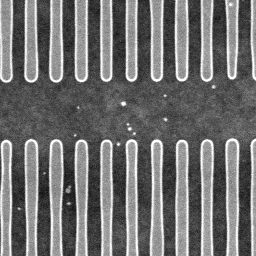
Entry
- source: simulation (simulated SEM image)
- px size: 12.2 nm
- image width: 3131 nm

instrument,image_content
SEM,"groups of lines, slits or small figures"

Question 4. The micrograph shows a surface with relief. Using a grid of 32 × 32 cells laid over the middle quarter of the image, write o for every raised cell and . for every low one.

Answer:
...ooo...ooo....oo....ooo...ooo.
...ooo...ooo....oo....ooo...ooo.
...ooo...ooo....oo....ooo...ooo.
...ooo....oo....oo....oo....oo..
................................
................................
................................
................................
................................
................................
................................
................................
................................
................................
................................
................................
................................
................................
................................
...oo.....oo....oo....oo.....o..
...ooo....oo....oo....oo....ooo.
...ooo...ooo....oo....oo....ooo.
...ooo...ooo....oo....oo....ooo.
...ooo...ooo....oo....oo....ooo.
...ooo...ooo....oo....oo....ooo.
...ooo...ooo....oo....oo....ooo.
...ooo...ooo....oo....oo....ooo.
...ooo...ooo....oo....oo....ooo.
...ooo...ooo....oo....oo....ooo.
...ooo...ooo....oo....oo....ooo.
...ooo...ooo....oo....oo....ooo.
...ooo...ooo....oo....oo....ooo.